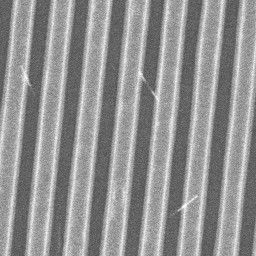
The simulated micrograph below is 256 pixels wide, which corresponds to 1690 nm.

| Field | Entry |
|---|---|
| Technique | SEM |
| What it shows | parallel lines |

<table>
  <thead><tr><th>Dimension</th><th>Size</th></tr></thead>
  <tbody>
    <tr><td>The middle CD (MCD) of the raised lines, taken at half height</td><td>0.127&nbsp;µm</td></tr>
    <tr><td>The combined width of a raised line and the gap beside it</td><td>249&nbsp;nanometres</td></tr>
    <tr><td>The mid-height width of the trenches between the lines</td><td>121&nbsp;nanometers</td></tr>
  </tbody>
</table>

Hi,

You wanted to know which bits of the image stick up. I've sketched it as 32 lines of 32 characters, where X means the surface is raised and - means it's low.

--XX---XX--XXX--XX---XX---XX--XX
--XX--XXX--XXX--XX---XX--XXX--XX
--XX--XXX--XXX--XX---XX--XXX--XX
--XX--XXX--XX---XX--XXX--XXX--XX
-XXX--XXX--XX---XX--XXX--XXX--XX
-XXX--XX---XX---XX--XXX--XXX--XX
-XXX--XX---XX--XXX--XXX--XX---XX
-XX---XX---XX--XXX--XX---XX---XX
-XX---XX---XX--XXX--XX---XX---XX
-XX---XX--XXX--XXX--XX---XX--XXX
-XX---XX--XXX--XX---XX---XX--XXX
-XX--XXX--XXX--XX---XX--XXX--XXX
-XX--XXX--XX---XX---XX--XXX--XX-
XXX--XXX--XX---XX--XXX--XXX--XX-
XXX--XXX--XX---XX--XXX--XX---XX-
XXX--XX---XX---XX--XXX--XX---XX-
XXX--XX---XX--XXX--XXX--XX---XX-
XX---XX---XX--XXX--XXX--XX---XX-
XX---XX--XXX--XXX--XX---XX--XXX-
XX---XX--XXX--XXX--XX---XX--XXX-
XX--XXX--XXX--XX---XX--XXX--XXX-
XX--XXX--XXX--XX---XX--XXX--XXX-
XX--XXX--XXX--XX---XX--XXX--XX--
XX--XXX--XX---XX--XXX--XXX--XX--
XX--XX---XX---XX--XXX--XX---XX--
XX--XX---XX--XXX--XXX--XX---XX--
XX--XX---XX--XXX--XXX--XX---XX--
XX--XX--XXX--XXX--XX---XX---XX--
X---XX--XXX--XXX--XX---XX--XXX--
X---XX--XXX--XXX--XX---XX--XXX--
X---XX--XXX--XX---XX---XX--XXX--
X--XXX--XXX--XX---XX--XXX--XXX--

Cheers